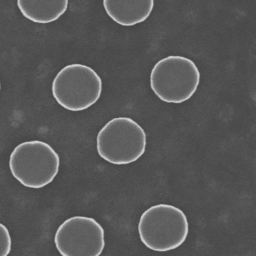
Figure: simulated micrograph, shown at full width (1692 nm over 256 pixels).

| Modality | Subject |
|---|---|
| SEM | raised bodies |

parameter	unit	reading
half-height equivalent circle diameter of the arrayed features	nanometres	306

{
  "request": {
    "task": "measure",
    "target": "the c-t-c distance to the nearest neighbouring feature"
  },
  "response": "541 nanometers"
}